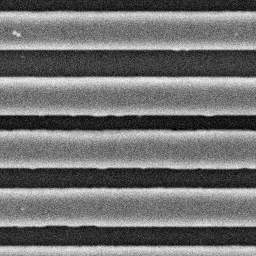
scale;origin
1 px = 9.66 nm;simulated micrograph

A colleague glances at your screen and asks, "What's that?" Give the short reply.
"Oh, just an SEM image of lines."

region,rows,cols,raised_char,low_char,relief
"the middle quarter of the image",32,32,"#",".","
................................
................................
................................
................................
################################
################################
################################
################################
################################
################################
################################
################################
################################
................................
................................
................................
................................
################################
################################
################################
################################
################################
################################
################################
################################
################################
................................
................................
................................
................................
................................
################################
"